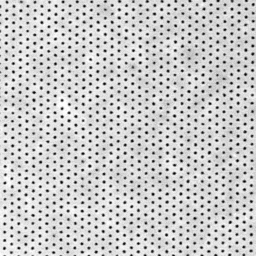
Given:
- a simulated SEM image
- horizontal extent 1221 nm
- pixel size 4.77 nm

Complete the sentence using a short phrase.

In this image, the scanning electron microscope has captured a regular array of holes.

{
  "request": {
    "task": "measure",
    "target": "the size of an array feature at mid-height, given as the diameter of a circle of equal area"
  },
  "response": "14.2 nm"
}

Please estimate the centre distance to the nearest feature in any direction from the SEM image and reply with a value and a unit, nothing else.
37.2 nm